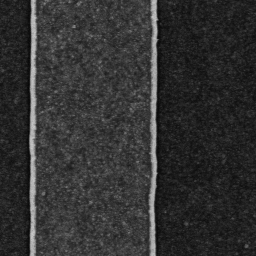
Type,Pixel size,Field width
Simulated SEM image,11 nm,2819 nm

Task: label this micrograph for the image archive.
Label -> one or a few lines or trenches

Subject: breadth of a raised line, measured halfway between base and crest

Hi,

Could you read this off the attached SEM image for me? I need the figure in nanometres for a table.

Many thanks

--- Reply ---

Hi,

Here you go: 1350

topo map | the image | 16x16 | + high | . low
..++++++++......
..++++++++......
..++++++++......
..++++++++......
..++++++++......
..++++++++......
..++++++++......
..++++++++......
..++++++++......
..++++++++......
..++++++++......
..++++++++......
..++++++++......
..++++++++......
..++++++++......
..++++++++......